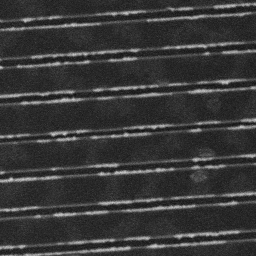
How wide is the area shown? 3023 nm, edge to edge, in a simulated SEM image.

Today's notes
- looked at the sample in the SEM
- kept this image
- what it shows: parallel lines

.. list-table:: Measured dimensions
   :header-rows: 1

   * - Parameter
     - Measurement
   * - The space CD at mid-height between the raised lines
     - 75.1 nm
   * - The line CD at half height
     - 364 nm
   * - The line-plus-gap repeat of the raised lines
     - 445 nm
